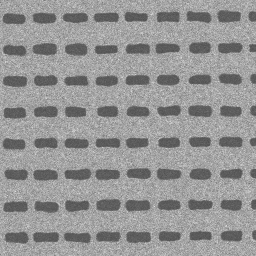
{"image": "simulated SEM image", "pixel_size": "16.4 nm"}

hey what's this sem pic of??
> a regular array of holes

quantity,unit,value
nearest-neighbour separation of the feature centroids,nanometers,496